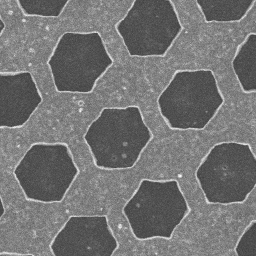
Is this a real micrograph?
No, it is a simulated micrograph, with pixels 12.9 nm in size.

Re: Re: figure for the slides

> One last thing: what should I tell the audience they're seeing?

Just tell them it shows holes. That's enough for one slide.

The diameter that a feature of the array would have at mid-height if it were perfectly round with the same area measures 765 nanometres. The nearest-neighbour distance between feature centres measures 1050 nanometers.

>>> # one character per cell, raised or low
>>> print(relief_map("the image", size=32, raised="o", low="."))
ooo.....ooooooooo....oooo.......
ooo.....oooooooo......ooo......o
ooooooooooooooo.......oooo....oo
ooooooooooooooo........ooooooooo
oooooooo....ooo.......ooooooooo.
ooooooo......ooo.....ooooooooo..
ooooooo......ooo.....ooooooooo..
oooooo........ooooooooooooooo...
oooooo.......oooooooooooooooo...
....ooo.....oooooooooo.....ooo..
....ooo.....ooooooooo......ooo..
.....ooooo.ooooooooo.......ooooo
.....ooooooooooooooo........oooo
....oooooooooooo.ooo.......ooooo
....oooooooo......ooo......ooooo
...oooooooo.......ooo.....oooooo
ooooooooooo........ooooooooooooo
ooooooooooo........ooooooooooooo
oooo....ooo.......ooooooooo....o
ooo......ooo.....ooooooooo......
oo.......ooo.....oooooooo.......
oo........ooooooooooooooo.......
oo.......oooooooooooooooo.......
ooo.....ooooooooo.....ooo.......
ooo.....ooooooooo......ooo.....o
oooooooooooooooo.......ooooooooo
ooooooooooooooo........ooooooooo
ooooooooo....ooo.......ooooooooo
oooooooo......oo......ooooooooo.
ooooooo.......ooo....ooooooooo..
ooooooo........ooooooooooooooo..
ooooooo.......oooooooooooooooo..